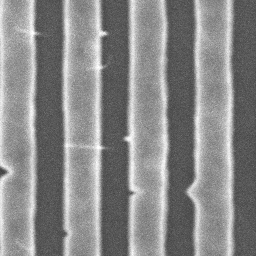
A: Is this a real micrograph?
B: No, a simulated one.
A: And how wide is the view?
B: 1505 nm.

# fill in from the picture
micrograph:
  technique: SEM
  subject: one or a few lines or trenches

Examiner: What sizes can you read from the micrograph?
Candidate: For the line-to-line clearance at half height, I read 183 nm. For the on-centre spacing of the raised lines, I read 0.385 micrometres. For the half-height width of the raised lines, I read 0.204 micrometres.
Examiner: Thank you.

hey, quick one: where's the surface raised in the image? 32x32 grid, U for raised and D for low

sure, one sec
UUUUDDDDUUUUDDDDUUUUDDDDUUUUUDDD
UUUUDDDDUUUUDDDDUUUUUDDDDUUUUDDD
UUUUDDDDUUUUDDDDUUUUUDDDDUUUUDDD
UUUUDDDDUUUUUDDDUUUUUDDDDUUUUDDD
UUUUDDDDUUUUUDDDUUUUUDDDDUUUUDDD
UUUUDDDDUUUUDDDDUUUUUDDDDUUUUDDD
UUUUDDDDUUUUDDDDUUUUUDDDUUUUUDDD
UUUUDDDDUUUUDDDDUUUUDDDDUUUUUDDD
UUUUDDDDUUUUDDDDUUUUDDDDUUUUUDDD
UUUUDDDDUUUUDDDDUUUUDDDDDUUUUDDD
UUUUDDDDUUUUDDDDUUUUUDDDDUUUUDDD
UUUUDDDDUUUUDDDDUUUUUDDDDUUUUDDD
UUUUDDDDUUUUDDDDUUUUUDDDDUUUUDDD
UUUUDDDDUUUUDDDDUUUUUDDDDUUUUDDD
UUUUDDDDUUUUDDDDUUUUUDDDUUUUUDDD
UUUUDDDDUUUUDDDDUUUUUDDDUUUUUDDD
UUUUDDDDUUUUDDDDUUUUUDDDDUUUUDDD
UUUUDDDDUUUUDDDDUUUUUDDDDUUUUDDD
UUUUDDDDUUUUDDDDUUUUUDDDUUUUUDDD
UUUUDDDDUUUUDDDDUUUUUDDDUUUUUDDD
UUUUDDDDUUUUDDDDUUUUUDDDUUUUUDDD
DUUUDDDDUUUUDDDDUUUUUDDDUUUUUDDD
UUUUDDDDUUUUDDDDUUUUUDDDUUUUUDDD
UUUUDDDDUUUUDDDDUUUUUDDDUUUUUDDD
UUUUDDDDUUUUDDDDDUUUUDDDUUUUUDDD
UUUUDDDDUUUUDDDDUUUUUDDDUUUUUDDD
UUUUDDDDUUUUDDDDUUUUUDDDDUUUUDDD
UUUUDDDDUUUUDDDDUUUUDDDDUUUUUDDD
UUUUDDDDUUUUDDDDUUUUDDDDUUUUUDDD
UUUUDDDDUUUUDDDDUUUUDDDDUUUUUDDD
UUUUDDDDUUUUDDDDUUUUDDDDUUUUUDDD
UUUUDDDDUUUUDDDDUUUUDDDDUUUUUDDD